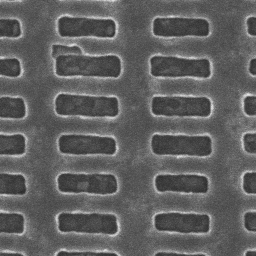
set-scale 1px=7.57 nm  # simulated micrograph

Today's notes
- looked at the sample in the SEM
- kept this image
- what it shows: a regular array of holes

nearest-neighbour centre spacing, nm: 292